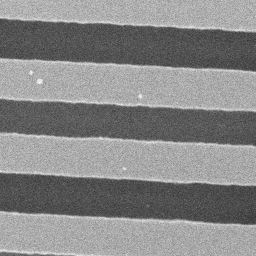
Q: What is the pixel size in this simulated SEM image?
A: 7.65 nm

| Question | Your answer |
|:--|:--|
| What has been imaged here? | lines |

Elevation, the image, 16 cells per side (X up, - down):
XXXXXXXXXXXXXXXX
-------XXXXXXXXX
----------------
----------------
XXXXXXXXXXXXXXXX
XXXXXXXXXXXXXXXX
-------XXXXXXXXX
----------------
XX--------------
XXXXXXXXXXXXXXXX
XXXXXXXXXXXXXXXX
-------------XXX
----------------
XXXX------------
XXXXXXXXXXXXXXXX
XXXXXXXXXXXXXXXX